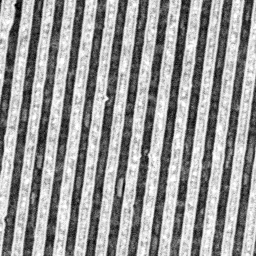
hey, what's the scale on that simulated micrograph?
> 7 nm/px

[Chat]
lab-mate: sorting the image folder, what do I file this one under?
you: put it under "parallel lines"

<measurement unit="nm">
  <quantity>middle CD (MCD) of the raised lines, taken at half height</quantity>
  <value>71.2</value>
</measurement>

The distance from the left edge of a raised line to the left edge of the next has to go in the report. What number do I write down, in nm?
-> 146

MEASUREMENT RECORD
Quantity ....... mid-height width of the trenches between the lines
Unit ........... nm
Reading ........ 71.2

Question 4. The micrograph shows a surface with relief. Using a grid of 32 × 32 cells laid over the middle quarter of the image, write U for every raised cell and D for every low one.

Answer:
UDDDUUDDDUUDDDUUDDDUUUDDDUUDDDUU
UDDUUUDDDUUDDDUUDDDUUUDDUUUDDDUU
DDDUUUDDDUUDDDUUDDDUUUDDUUUDDDUU
DDDUUUDDDUUDDDUUDDDUUDDDUUUDDUUU
DDDUUDDDUUUDDDUUDDDUUDDDUUDDDUUU
DDDUUDDDUUDDDUUUDDDUUDDDUUUDDUUU
DDDUUDDDUUDDDUUUDDDUUDDDUUDDDUUU
DDDUUDDDUUDDDUUUDDDUUDDDUUDDDUUD
DDDUUDDDUUUDDUUDDDUUUDDDUUDDDUUD
DDUUUDDDUUDDDUUDDDUUUDDUUUDDDUUD
DDUUUDDUUUDDDUUDDDUUUDDUUUDDDUUD
DDUUUDDUUUDDDUUDDDUUDDDUUUDDUUUD
DDUUDDDUUUDDUUUDDDUUDDDUUUDDUUUD
DDUUDDDUUDDDUUUDDUUUDDDUUDDDUUUD
DDUUDDDUUDDDUUUDDDUUDDDUUDDDUUDD
DDUUDDDUUDDDUUUDDUUUDDDUUDDDUUDD
DUUUDDDUUDDDUUDDDUUUDDUUUDDDUUDD
DUUUDDUUUDDDUUDDDUUUDDUUUDDDUUDD
DUUUDDUUUDDDUUDDDUUDDDUUUDDDUUDD
DUUUDDUUUDDDUUDDDUUDDDUUDDDUUUDD
DUUDDDUUUDDUUUDDDUUDDDUUDDDUUUDD
DUUDDDUUDDDUUUDDDUUDDDUUDDDUUUDD
DUUDDDUUDDDUUUDDDUUDDUUUDDDUUDDD
DUUDDDUUDDDUUDDDUUUDDUUUDDDUUDDD
UUUDDDUUDDDUUDDDUUUDDUUUDDDUUDDD
UUUDDDUUDDDUUDDDUUUDDUUUDDDUUDDD
UUUDDDUUDDDUUDDDUUDDDUUUDDUUUDDD
UUDDDUUUDDDUUDDDUUDDDUUUDDUUUDDD
UUDDDUUDDDUUUDDDUUDDDUUUDDUUUDDU
UUDDDUUDDDUUUDDUUUDDDUUDDDUUUDDU
UUDDDUUDDDUUUDDUUUDDDUUDDDUUDDDU
UUDDDUUDDDUUDDDUUUDDDUUDDDUUDDDU